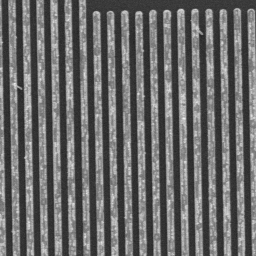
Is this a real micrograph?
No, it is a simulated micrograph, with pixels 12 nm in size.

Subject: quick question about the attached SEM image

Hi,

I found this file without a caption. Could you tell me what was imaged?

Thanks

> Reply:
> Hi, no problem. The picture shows parallel lines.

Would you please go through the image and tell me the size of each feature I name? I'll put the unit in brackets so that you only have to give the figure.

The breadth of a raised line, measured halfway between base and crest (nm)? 73.5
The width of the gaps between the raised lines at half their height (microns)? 0.0945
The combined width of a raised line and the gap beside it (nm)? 169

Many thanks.